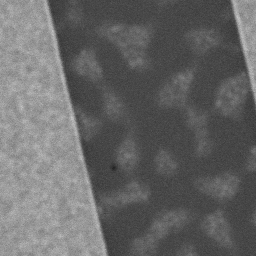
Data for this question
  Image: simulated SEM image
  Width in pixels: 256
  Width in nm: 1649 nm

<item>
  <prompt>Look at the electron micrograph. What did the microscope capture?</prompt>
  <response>one or a few lines or trenches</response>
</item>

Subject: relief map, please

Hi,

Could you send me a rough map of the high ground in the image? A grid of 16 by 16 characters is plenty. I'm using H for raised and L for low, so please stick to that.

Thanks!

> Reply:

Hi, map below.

HHHLLLLLLLLLLLLH
HHHLLLLLLLLLLLLH
HHHLLLLLLLLLLLLH
HHHHLLLLLLLLLLLH
HHHHLLLLLLLLLLLL
HHHHLLLLLLLLLLLL
HHHHLLLLLLLLLLLL
HHHHHLLLLLLLLLLL
HHHHHLLLLLLLLLLL
HHHHHLLLLLLLLLLL
HHHHHLLLLLLLLLLL
HHHHHHLLLLLLLLLL
HHHHHHLLLLLLLLLL
HHHHHHLLLLLLLLLL
HHHHHHLLLLLLLLLL
HHHHHHLLLLLLLLLL